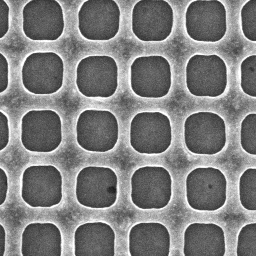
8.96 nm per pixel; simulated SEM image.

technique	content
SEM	a regular array of holes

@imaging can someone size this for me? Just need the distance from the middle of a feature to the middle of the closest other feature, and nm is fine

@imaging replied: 488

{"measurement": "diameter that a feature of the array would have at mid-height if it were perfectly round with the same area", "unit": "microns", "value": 0.398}